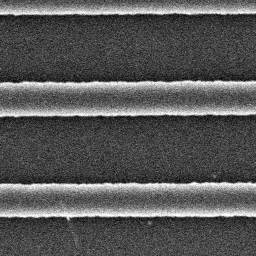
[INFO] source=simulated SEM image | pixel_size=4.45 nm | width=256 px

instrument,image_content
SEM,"lines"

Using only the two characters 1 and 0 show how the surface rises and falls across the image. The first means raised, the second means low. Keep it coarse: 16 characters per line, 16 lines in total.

1111111111111111
0000000000000000
0000000000000000
0000000000000000
0000000000000000
1111111111111111
1111111111111111
0000000000000000
0000000000000000
0000000000000000
0000000000000000
0000001011111111
1111111111111111
1111111111111111
0000000000000000
0000000000000000